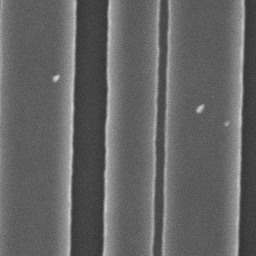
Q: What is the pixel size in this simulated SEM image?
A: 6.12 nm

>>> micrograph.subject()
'lines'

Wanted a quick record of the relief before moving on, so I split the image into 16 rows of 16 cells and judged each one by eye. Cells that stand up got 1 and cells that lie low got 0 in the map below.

1111100111111110
1111100111111110
1111100111111110
1111100111111110
1111100111111110
1111100111111110
1111100111111110
1111000111111110
1111000111111110
1111000111111110
1111000111111110
1111000111111110
1111000111111110
1111000111111110
1111000111111110
1111000111111110